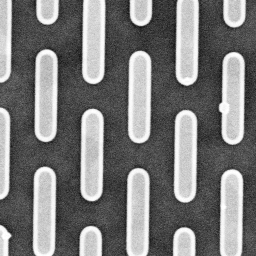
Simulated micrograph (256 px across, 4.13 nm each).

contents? groups of lines, slits or small figures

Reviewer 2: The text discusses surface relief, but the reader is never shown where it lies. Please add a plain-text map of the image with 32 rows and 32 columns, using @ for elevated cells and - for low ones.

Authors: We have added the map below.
@----@@----@@----@@---@@@---@@--
@----@@----@@----@@---@@@---@@--
@----@@----@@----@----@@@---@@--
@----------@@---------@@@-------
@----------@@---------@@@-------
@----------@@---------@@@-------
@----------@@---------@@@-------
@----@@----@@---@@@---@@@---@@--
@----@@----@@---@@@---@@@---@@--
@----@@----@@---@@@---@@----@@--
-----@@---------@@@----@----@@--
-----@@---------@@@---------@@--
-----@@---------@@@---------@@--
-----@@---------@@@--------@@@--
@----@@----@----@@@---@@----@@--
@----@@---@@@---@@@---@@----@@--
@----@@---@@@---@@----@@----@@--
@---------@@@----@----@@----@@--
@---------@@@---------@@--------
@---------@@@---------@@--------
@---------@@@---------@@--------
@----@----@@@----@----@@--------
@----@@---@@@---@@----@@----@@--
@----@@---@@----@@----@@----@@--
-----@@----@----@@----@@----@@--
-----@@---------@@----------@@--
----@@@---------@@----------@@--
----@@@---------@@----------@@--
----@@@---------@@----------@@--
@---@@@---@@----@@----@@----@@--
@---@@@---@@----@@----@@----@@--
@----@----@@----@@----@@----@@--